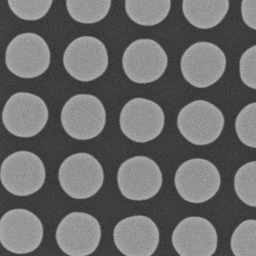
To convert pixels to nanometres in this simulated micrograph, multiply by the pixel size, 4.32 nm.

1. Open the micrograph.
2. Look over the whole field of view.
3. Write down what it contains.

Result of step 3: an array of small figures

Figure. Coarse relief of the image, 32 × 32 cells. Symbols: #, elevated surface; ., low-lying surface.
.#####..######..#####..######.##
..####...#####..#####..#####..##
..........###....###...#####..##
.........................#......
..###...........................
.#####...####...####....###.....
.#####..#####...#####..#####...#
.#####..#####..######..#####..##
.#####..#####..######..#####..##
..###....###....####...#####..##
........................###....#
................................
.####....###....###.............
######..#####..#####...####...##
######..#####..######.######..##
######..#####..#####..######.###
.####...#####..#####...#####..##
.................##....####...##
................................
.####....##.....................
#####...####...#####...####....#
######.######..#####..#####...##
######.######..#####..######.###
.####...####...#####..#####..###
.........##.....###....####...##
...............................#
.###............................
#####...####...####....###.....#
#####..######.######..#####...##
#####..######.######..#####..###
#####..#####..######..#####..###
..##....####...####...#####..###